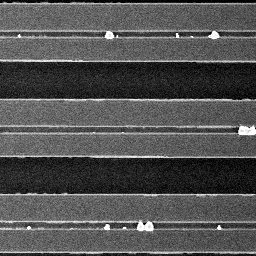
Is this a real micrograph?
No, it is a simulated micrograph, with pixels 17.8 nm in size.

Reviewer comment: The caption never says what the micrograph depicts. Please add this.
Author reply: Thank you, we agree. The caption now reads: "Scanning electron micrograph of lines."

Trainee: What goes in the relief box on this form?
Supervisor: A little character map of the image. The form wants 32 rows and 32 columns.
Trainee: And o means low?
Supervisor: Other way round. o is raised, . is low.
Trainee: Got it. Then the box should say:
oooooooooooooooooooooooooooooooo
oooooooooooooooooooooooooooooooo
oooooooooooooooooooooooooooooooo
oooooooooooooooooooooooooooooooo
oooooooooooooooooooooooooooooooo
oooooooooooooooooooooooooooooooo
oooooooooooooooooooooooooooooooo
oooooooooooooooooooooooooooooooo
................................
................................
................................
................................
ooooooooo.ooooooooo..ooooo.oo..o
oooooooooooooooooooooooooooooooo
oooooooooooooooooooooooooooooooo
oooooooooooooooooooooooooooooooo
oooooooooooooooooooooooooooooooo
oooooooooooooooooooooooooooooooo
oooooooooooooooooooooooooooooooo
oooooooooooooooooooooooooooooooo
................................
................................
................................
................................
oooooooooooooooooooooooooooooooo
oooooooooooooooooooooooooooooooo
oooooooooooooooooooooooooooooooo
oooooooooooooooooooooooooooooooo
oooooooooooooooooooooooooooooooo
oooooooooooooooooooooooooooooooo
oooooooooooooooooooooooooooooooo
oooooooooooooooooooooooooooooooo